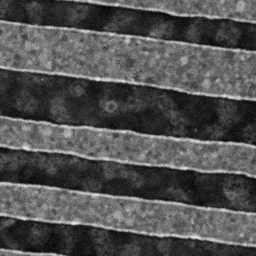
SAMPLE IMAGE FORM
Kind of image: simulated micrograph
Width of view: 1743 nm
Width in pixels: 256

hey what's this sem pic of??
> one or a few lines or trenches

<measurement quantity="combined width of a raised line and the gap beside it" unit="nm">521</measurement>